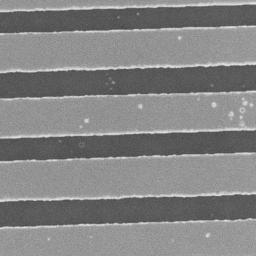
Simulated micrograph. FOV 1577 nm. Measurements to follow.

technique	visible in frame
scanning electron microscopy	lines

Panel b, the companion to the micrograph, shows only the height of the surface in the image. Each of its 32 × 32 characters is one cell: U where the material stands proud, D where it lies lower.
UUUUUUUUUUUUUUUUUUUUUUUUUUUDDDDD
DDDDDDDDDDDDDDDDDDDDDDDDDDDDDDDD
DDDDDDDDDDDDDDDDDDDDDDDDDDDDDDDD
DDDDDDDDDDDDDDDDDDDDDDUUUUUUUUUU
UUUUUUUUUUUUUUUUUUUUUUUUUUUUUUUU
UUUUUUUUUUUUUUUUUUUUUUUUUUUUUUUU
UUUUUUUUUUUUUUUUUUUUUUUUUUUUUUUU
UUUUUUUUUUUUUUUUUUUUUUUUUUUUUUUU
UUUUUUUUUUUUUUUUUUDDDDDDDDDDDDDD
DDDDDDDDDDDDDDDDDDDDDDDDDDDDDDDD
DDDDDDDDDDDDDDDDDDDDDDDDDDDDDDDD
DDDDDDDDDDDDDDDDDDDDDDDDDDDDDDUU
UUUUUUUUUUUUUUUUUUUUUUUUUUUUUUUU
UUUUUUUUUUUUUUUUUUUUUUUUUUUUUUUU
UUUUUUUUUUUUUUUUUUUUUUUUUUUUUUUU
UUUUUUUUUUUUUUUUUUUUUUUUUUUUUUUU
UUUUUUUUUUUUUUUUUUUUUDDDDDDDDDDD
DDDDDDDDDDDDDDDDDDDDDDDDDDDDDDDD
DDDDDDDDDDDDDDDDDDDDDDDDDDDDDDDD
DDDDDDDDDDDDDDDDDDDUUUUUUUUUUUUU
UUUUUUUUUUUUUUUUUUUUUUUUUUUUUUUU
UUUUUUUUUUUUUUUUUUUUUUUUUUUUUUUU
UUUUUUUUUUUUUUUUUUUUUUUUUUUUUUUU
UUUUUUUUUUUUUUUUUUUUUUUUUUUUUUUU
UUUUUUUUUUUUUUUUUUUUUUUUUDDDDDDD
DDDDDDDDDDDDDDDDDDDDDDDDDDDDDDDD
DDDDDDDDDDDDDDDDDDDDDDDDDDDDDDDD
DDDDDDDDDDDDDDDDDDDDDDDDDDDDDDUU
UUUUUUUUUUUUUUUUUUUUUUUUUUUUUUUU
UUUUUUUUUUUUUUUUUUUUUUUUUUUUUUUU
UUUUUUUUUUUUUUUUUUUUUUUUUUUUUUUU
UUUUUUUUUUUUUUUUUUUUUUUUUUUUUUUU